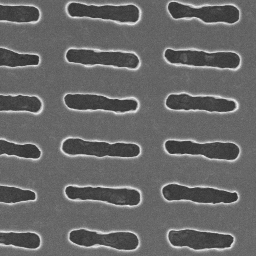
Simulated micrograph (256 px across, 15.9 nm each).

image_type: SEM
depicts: a regular array of holes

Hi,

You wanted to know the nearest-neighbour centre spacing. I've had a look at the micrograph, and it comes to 716 nm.